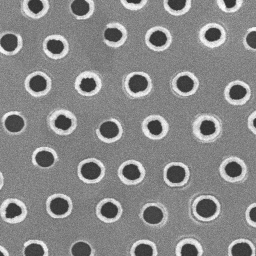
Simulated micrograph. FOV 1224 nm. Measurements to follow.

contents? a regular array of holes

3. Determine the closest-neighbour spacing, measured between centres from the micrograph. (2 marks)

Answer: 218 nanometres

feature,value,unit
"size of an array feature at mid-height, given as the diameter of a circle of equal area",79.5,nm